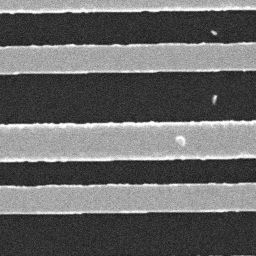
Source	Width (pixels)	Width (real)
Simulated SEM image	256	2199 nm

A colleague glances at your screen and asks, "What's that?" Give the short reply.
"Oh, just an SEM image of lines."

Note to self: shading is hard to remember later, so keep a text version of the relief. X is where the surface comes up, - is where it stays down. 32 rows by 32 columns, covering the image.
XXXXXXXXXXXXXXXXXXXXXXXXXXXXXXXX
XXXXXXX-------------------------
--------------------------------
--------------------------------
--------------------------------
-------------------XXXXXXXXXXXXX
XXXXXXXXXXXXXXXXXXXXXXXXXXXXXXXX
XXXXXXXXXXXXXXXXXXXXXXXXXXXXXXXX
XXXXXXXXXXXXXXXXXXXXXXXXXXXXXXXX
--------------------------------
--------------------------------
--------------------------------
--------------------------------
--------------------------------
--------------------------------
--------X---XXXXXXXXXXXXXXXXXXXX
XXXXXXXXXXXXXXXXXXXXXXXXXXXXXXXX
XXXXXXXXXXXXXXXXXXXXXXXXXXXXXXXX
XXXXXXXXXXXXXXXXXXXXXXXXXXXXXXXX
XXXXXXXXXXXXXXXXXXXXXXXXXXXXXXXX
--------------------------------
--------------------------------
--------------------------------
XXXXXXXXXXXXXXXXXXXXXXXXXXXXXXXX
XXXXXXXXXXXXXXXXXXXXXXXXXXXXXXXX
XXXXXXXXXXXXXXXXXXXXXXXXXXXXXXXX
XXXXXXXXXXXXXXXXXXX-------------
--------------------------------
--------------------------------
--------------------------------
--------------------------------
--------------------------------